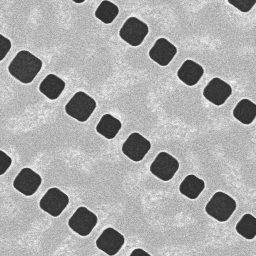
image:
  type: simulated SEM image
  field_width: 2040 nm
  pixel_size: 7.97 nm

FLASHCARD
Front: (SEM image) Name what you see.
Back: a regular array of holes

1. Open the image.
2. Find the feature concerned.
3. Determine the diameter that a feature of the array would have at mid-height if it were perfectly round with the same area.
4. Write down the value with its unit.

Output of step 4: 211 nanometers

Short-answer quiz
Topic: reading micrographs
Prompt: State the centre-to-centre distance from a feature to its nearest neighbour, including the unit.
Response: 0.272 um